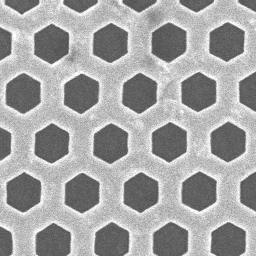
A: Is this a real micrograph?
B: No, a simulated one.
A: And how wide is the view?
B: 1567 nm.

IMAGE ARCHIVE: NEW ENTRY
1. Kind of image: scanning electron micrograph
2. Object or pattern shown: a regular array of holes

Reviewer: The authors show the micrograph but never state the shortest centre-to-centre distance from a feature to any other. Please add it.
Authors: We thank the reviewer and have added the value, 351 nm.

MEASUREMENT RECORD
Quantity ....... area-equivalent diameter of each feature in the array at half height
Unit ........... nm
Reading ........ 226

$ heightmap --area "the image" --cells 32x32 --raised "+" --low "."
+....+++....++++...++++...++++..
++.+++++++++++++++++++++.+++++++
++++++++++++++++++++++++++++++++
+++++..++++++..+++++...++++...++
.+++.....+++....+++....+++.....+
.+++.....+++....+++....+++.....+
.+++.....+++....+++....+++....++
+++++..++++++..+++++..++++++.+++
++++++++++++++++++++++++++++++++
++..++++++.++++++.++++++..+++++.
+....+++....++++....+++....+++..
+....+++....+++.....+++....+++..
+....+++....+++.....+++....+++..
++..+++++..+++++...+++++..+++++.
++++++++++++++++++++++++++++++++
+++++++++++++++++++++.++++++.+++
.++++...++++....+++....++++....+
.+++.....+++....+++....+++.....+
.+++.....+++....+++....+++.....+
.++++...++++...+++++...++++...++
++++++++++++++++++++++++++++++++
++++++++++++++++++++++++++++++++
+....++++...++++...++++....+++..
+....+++....+++.....+++....+++..
+....+++....+++.....+++....+++..
+....+++....++++...++++....+++..
+++++++++++++++++.++++++++++++++
++++++++++++++++++++++++++++++++
++++++..+++++..+++++...++++...++
..++.....+++....+++.....++.....+
..++.....+++....+++.....++.....+
..++.....+++....+++....++++...++